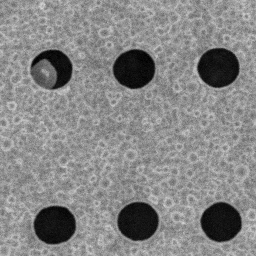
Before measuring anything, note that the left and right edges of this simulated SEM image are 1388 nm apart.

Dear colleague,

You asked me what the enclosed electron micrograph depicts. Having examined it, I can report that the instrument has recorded holes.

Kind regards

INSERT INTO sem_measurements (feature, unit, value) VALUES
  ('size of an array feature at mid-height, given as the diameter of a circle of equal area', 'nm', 224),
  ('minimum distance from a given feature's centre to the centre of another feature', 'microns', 0.45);